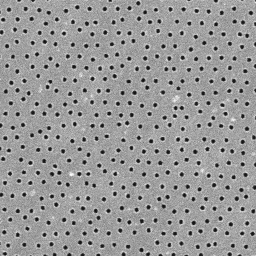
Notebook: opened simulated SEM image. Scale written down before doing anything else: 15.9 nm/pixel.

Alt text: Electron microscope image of a regular array of holes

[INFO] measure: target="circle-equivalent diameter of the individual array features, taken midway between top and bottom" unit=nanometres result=70.8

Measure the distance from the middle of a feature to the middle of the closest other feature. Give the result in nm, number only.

171